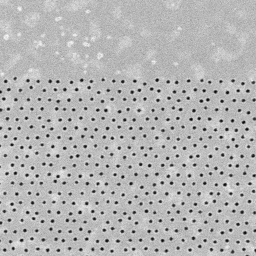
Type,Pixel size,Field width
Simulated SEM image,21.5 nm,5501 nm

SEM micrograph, a regular array of holes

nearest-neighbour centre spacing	193	nm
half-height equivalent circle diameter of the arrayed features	87.4	nanometers